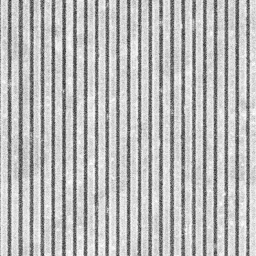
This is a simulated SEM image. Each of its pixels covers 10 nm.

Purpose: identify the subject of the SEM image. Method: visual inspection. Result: parallel lines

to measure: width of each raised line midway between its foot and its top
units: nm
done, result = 59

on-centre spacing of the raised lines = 109 nm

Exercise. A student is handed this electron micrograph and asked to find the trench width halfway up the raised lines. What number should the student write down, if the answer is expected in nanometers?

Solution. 49